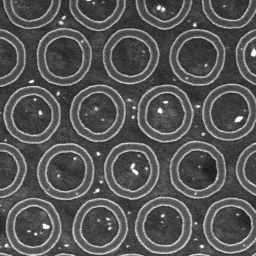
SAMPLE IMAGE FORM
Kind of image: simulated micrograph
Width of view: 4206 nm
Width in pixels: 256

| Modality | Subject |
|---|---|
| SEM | a regular array of ring-shaped raised bodies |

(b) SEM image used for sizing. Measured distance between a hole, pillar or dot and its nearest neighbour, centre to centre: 1070 nanometres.